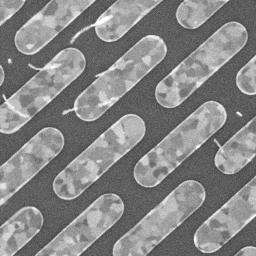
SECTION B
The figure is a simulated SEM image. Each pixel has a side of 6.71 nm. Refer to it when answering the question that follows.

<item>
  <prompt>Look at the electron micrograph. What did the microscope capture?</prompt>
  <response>groups of lines, slits or small figures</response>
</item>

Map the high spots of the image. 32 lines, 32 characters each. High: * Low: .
***...*****...******...*****....
**...*****...*****....*****.....
*...*****...*****.....****......
...*****....****.......*....***.
..*****.....***...........*****.
..****...........***.....******.
...*....**......*****...******..
.......****....*****...*****...*
.....*****....*****...*****...**
....******..******...*****....**
...******..******...*****.....**
..*****...******...*****.......*
.*****....*****.....***.........
*****....*****...........***....
****......***...*.......****....
***...........****.....*****...*
.....**......*****...******...**
....****....******..******...***
...*****...*****...******..*****
..*****...*****...******...*****
.*****...*****...*****.....****.
*****...*****....****.......**..
****...*****.....***...........*
**.....****...........***.....**
*......***...**......*****...***
............***.....*****...****
..***......****....*****...*****
.****....******...*****...*****.
*****...******...*****...*****..
****...******...*****...*****...
***...*****...******....****....
**...*****....*****.......*...**